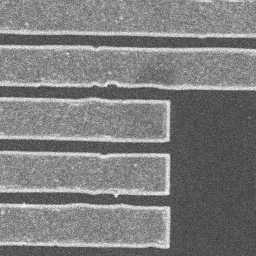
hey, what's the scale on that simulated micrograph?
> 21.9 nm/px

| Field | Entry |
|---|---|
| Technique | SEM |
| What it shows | parallel lines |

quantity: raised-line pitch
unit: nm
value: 1160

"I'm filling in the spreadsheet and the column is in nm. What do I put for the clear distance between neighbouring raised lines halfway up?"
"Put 315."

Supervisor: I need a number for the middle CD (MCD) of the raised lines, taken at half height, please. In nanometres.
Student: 840